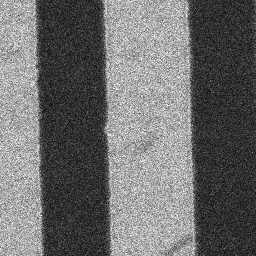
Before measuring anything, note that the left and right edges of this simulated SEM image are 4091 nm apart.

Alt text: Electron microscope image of one or a few lines or trenches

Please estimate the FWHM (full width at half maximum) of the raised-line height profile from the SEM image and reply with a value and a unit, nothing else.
1150 nanometers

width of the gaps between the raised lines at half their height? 81 px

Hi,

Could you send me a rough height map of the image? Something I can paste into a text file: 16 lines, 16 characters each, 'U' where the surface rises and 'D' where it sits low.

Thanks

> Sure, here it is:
DDUUUUUDDDDDUUUU
DDUUUUUDDDDDUUUU
DDUUUUUDDDDDUUUU
DDUUUUUDDDDDUUUU
DDUUUUUDDDDDUUUU
DDUUUUUDDDDDUUUU
DDUUUUUDDDDDUUUU
DDUUUUUDDDDDUUUU
DDUUUUUDDDDDUUUU
DDUUUUUDDDDDUUUU
DDUUUUUDDDDDUUUU
DDUUUUUDDDDDUUUU
DDUUUUUDDDDDUUUU
DDDUUUUDDDDDUUUU
DDDUUUUDDDDDUUUU
DDDUUUUDDDDDUUUU